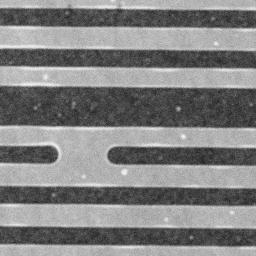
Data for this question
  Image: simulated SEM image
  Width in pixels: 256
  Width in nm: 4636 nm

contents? groups of lines, slits or small figures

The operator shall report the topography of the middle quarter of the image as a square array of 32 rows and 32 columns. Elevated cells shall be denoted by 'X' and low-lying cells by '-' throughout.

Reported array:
--------------------------------
XXXXXXXXXXXXXXXXXXXXXXXXXXXXXXXX
XXXXXXXXXXXXXXXXXXXXXXXXXXXXXXXX
XXXXXXXXXXXXXXXXXXXXXXXXXXXXXXXX
XXXXXXXXXXXXXXXXXXXXXXXXXXXXXXXX
----------------XX--------XXXXXX
--------------------------------
--------------------------------
--------------------------------
--------------------------------
--------------------------------
--------------------------------
--------------------------------
--------------------------------
--------------------------------
--------------------------------
XXXXXXXXXXXXXXXXXXXXXXXXXXXXXXXX
XXXXXXXXXXXXXXXXXXXXXXXXXXXXXXXX
XXXXXXXXXXXXXXXXXXXXXXXXXXXXXXXX
XXXXXXXXXXXXXXXXXXXXXXXXXXXXXXXX
XXXXXXXXXXXXX-XXXXXX-----XXXXXXX
XXXXXXXXXXX---------------------
XXXXXXXXXXX---------------------
XXXXXXXXXXX---------------------
XXXXXXXXXXX---------------------
XXXXXXXXXXXXXXXXXXXXXXXXX-------
XXXXXXXXXXXXXXXXXXXXXXXXXXXXXXXX
XXXXXXXXXXXXXXXXXXXXXXXXXXXXXXXX
XXXXXXXXXXXXXXXXXXXXXXXXXXXXXXXX
XXXXXXXXXXXXXXXXXXXXXXXXXXXXXXXX
-------------XXXXXXXXXXXXXXXXXXX
--------------------------------